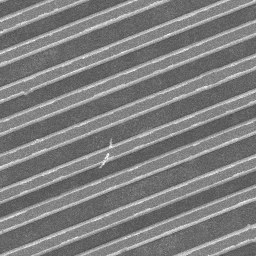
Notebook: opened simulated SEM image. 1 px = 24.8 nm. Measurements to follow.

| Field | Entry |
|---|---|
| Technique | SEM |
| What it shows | parallel lines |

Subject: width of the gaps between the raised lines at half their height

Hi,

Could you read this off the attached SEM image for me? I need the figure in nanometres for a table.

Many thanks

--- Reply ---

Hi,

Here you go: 450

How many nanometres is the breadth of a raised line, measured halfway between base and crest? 338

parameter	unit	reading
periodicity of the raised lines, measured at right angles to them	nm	773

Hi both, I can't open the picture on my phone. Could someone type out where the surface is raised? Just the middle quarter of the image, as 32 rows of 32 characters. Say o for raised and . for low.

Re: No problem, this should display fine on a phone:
ooooooo............ooooooooo....
oooo............ooooooooo.......
oo............ooooooooo.........
...........ooooooooo............
.........ooooooooo............oo
......ooooooooo.............oooo
....ooooooooo.............oooooo
.ooooooooo.............ooooooooo
oooooooo............ooooooooo...
ooooo.............ooooooooo.....
ooo............ooooooooo........
.............ooooooooo..........
...........oooooooo.............
.......oooooooooo.............oo
.....ooooooooo.............ooooo
..oooooooooo.............ooooooo
ooooooooo.............ooooooooo.
oooooo..............oooooooo....
oooo.............ooooooooo......
o..............oooooooo.........
...........oooooooooo..........o
.........ooooooooo..........oooo
.......oooooooo..........ooooooo
....ooooooooo..........ooooooooo
..oooooooo..........oooooooooo..
oooooooo..........ooooooooo.....
ooooo..........oooooooooo.......
ooo..........ooooooooo..........
..........ooooooooo.............
........ooooooooo..............o
.....ooooooooo..............oooo
...ooooooooo..............oooooo